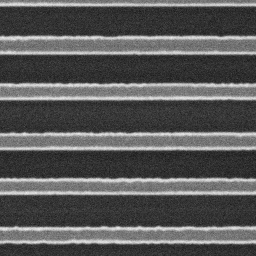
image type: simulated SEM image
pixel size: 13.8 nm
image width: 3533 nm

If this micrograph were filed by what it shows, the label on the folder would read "lines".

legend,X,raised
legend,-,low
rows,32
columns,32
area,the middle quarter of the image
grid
--------------------------------
--------------------------------
--------------------------------
--------------------------------
--------------------------------
XXXXXXXXXXXXXXXXXXXXXXXXXXXXXXXX
XXXXXXXXXXXXXXXXXXXXXXXXXXXXXXXX
XXXXXXXXXXXXXXXXXXXXXXXXXXXXXXXX
XXXXXXXXXXXXXXXXXXXXXXXXXXXXXXXX
--------------------------------
--------------------------------
--------------------------------
--------------------------------
--------------------------------
--------------------------------
--------------------------------
--------------------------------
--XXXX---XXXXXX--X-XX---XXXXXXXX
XXXXXXXXXXXXXXXXXXXXXXXXXXXXXXXX
XXXXXXXXXXXXXXXXXXXXXXXXXXXXXXXX
XXXXXXXXXXXXXXXXXXXXXXXXXXXXXXXX
--------------------------------
--------------------------------
--------------------------------
--------------------------------
--------------------------------
--------------------------------
--------------------------------
--------------------------------
XXXXXXXXXXXXXXXXXXXXXXXXXXXXXXXX
XXXXXXXXXXXXXXXXXXXXXXXXXXXXXXXX
XXXXXXXXXXXXXXXXXXXXXXXXXXXXXXXX